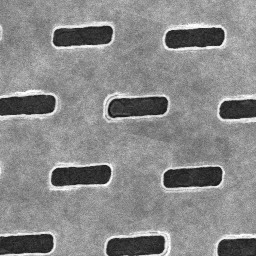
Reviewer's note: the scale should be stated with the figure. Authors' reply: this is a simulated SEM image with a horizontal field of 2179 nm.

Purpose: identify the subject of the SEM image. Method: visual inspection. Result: holes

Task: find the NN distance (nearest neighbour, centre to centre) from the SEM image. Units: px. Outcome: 89.1